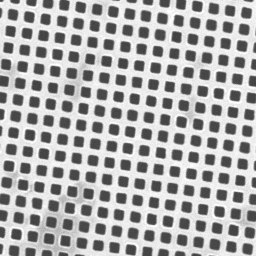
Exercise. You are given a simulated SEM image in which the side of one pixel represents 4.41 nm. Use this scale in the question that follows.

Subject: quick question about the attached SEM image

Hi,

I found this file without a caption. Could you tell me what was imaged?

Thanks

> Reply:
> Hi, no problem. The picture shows a regular array of holes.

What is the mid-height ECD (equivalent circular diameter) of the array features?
51.7 nanometres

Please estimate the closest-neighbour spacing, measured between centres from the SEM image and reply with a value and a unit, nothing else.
72.2 nm